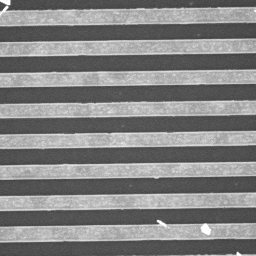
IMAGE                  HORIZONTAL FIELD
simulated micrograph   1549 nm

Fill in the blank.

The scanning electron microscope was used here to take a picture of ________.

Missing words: parallel lines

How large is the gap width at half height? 108 nm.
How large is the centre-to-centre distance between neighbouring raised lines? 0.187 micrometres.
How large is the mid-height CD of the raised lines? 13 px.